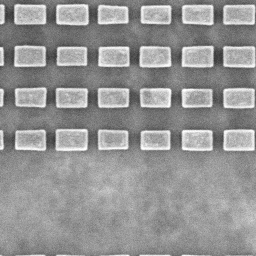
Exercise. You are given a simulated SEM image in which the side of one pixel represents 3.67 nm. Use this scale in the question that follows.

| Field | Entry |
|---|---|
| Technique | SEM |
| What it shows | wiring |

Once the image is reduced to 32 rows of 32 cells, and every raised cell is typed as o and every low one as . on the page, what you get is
................................
..oooo.oooo.oooo..ooo..oooo.oooo
..oooo.oooo.oooo..ooo..oooo.oooo
................................
................................
................................
..oooo.oooo.oooo..ooo..oooo.oooo
..oooo.oooo.oooo..ooo..oooo.oooo
................................
................................
................................
..oooo.oooo.oooo..ooo..ooo..oooo
..oooo.oooo.oooo..ooo..ooo..oooo
................................
................................
................................
..oooo.oooo.oooo..ooo..ooo..oooo
..oooo.oooo.oooo..ooo..ooo..oooo
..oooo.oooo..ooo..ooo..ooo..oooo
................................
................................
................................
................................
................................
................................
................................
................................
................................
................................
................................
................................
................................